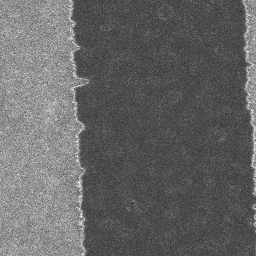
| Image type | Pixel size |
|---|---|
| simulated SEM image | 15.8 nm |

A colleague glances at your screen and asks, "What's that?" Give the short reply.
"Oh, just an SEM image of one or a few lines or trenches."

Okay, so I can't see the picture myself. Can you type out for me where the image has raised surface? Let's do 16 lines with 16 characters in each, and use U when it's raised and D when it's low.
DDDDUUUUUUUUUUUD
DDDDUUUUUUUUUUUD
DDDDDUUUUUUUUUUD
DDDDDUUUUUUUUUUD
DDDDDUUUUUUUUUUU
DDDDDUUUUUUUUUUD
DDDDDUUUUUUUUUUU
DDDDDUUUUUUUUUUU
DDDDDUUUUUUUUUUU
DDDDDUUUUUUUUUUU
DDDDDUUUUUUUUUUU
DDDDDUUUUUUUUUUU
DDDDDUUUUUUUUUUU
DDDDDUUUUUUUUUUU
DDDDDUUUUUUUUUUU
DDDDDUUUUUUUUUUU